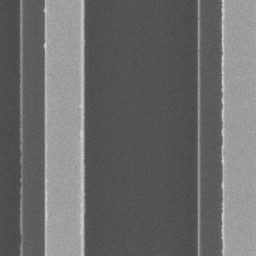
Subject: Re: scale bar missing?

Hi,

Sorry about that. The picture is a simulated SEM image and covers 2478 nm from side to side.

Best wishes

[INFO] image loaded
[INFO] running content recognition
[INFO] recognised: lines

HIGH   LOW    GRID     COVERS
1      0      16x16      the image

0111100000001111
0111100000001111
0111100000001111
0111100000001111
0111100000001111
0111100000001111
0111100000001111
0111100000001111
0111100000001111
0111100000001111
0111100000001111
0111100000001111
0111100000001111
0111100000001111
0111100000001111
0111100000001111